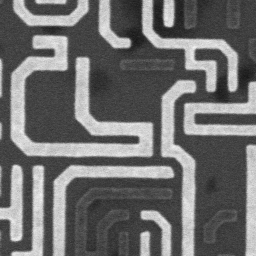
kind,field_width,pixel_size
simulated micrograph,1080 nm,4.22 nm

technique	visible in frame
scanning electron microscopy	wiring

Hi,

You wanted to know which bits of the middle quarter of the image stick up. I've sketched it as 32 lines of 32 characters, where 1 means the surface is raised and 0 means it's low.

10011100000000111111111111100011
00011100000000000000000000000000
00011100000000000000000000000000
00011100000000000000000000000000
00011100000000000000000000001111
00011100000000000000000000011111
00011100000000000000000000111111
00011100000000000000000001111000
00011100000000000000000001110000
00011100000000000000000001100000
00011100000000000000000001100011
00011100000000000000000001100011
00011100000000000000000001100011
00011110000000000000000001100011
00001111100000000000000001100011
00000111111111111111110001100011
00000011111111111111110001100011
00000001111111111111110001100000
00000000000000000001110001100000
00000000000000000001110001100000
11111111111111111111110001110000
11111111111111111111110001111100
11111111111111111111110001111110
00000000000000000000000000001111
00000000000000000000000000000111
00100000000000000000000000000011
11111111111111111111111111100011
11111111111111111111111111100011
11000000000000000000000000000011
10000000000000000000000000000011
00000000000000000000000000000011
00000011111111111111111111100011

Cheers